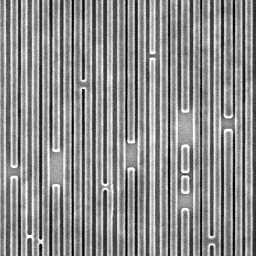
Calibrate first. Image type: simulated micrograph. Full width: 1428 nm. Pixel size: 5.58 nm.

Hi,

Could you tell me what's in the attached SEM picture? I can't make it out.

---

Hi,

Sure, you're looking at parallel lines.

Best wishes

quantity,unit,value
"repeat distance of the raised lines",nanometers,59.3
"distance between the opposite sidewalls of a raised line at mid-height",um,0.0383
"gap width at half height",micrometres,0.0195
